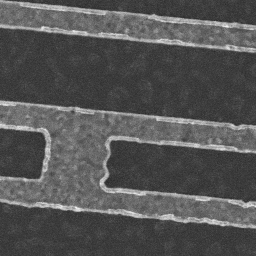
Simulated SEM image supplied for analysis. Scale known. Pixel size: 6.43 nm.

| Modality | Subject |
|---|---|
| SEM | one or a few lines or trenches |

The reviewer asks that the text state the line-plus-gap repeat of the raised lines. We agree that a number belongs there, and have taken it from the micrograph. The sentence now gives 560 nanometers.